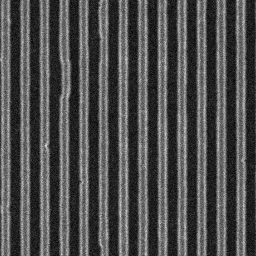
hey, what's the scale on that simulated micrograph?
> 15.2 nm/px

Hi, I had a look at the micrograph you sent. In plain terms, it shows parallel lines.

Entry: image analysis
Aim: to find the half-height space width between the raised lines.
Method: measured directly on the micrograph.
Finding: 184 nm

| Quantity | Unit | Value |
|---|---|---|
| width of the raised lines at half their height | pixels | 7.5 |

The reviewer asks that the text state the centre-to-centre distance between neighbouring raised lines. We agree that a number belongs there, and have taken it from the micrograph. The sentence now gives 297 nanometers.